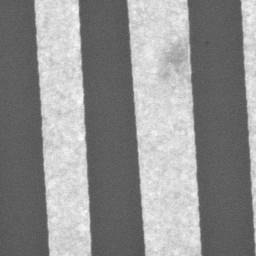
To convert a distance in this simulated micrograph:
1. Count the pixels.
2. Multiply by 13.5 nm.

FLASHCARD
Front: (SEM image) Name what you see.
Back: lines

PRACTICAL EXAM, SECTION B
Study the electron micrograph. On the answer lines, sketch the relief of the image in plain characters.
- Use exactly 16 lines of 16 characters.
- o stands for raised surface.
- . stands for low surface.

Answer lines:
..ooo...oooo...o
..ooo...oooo...o
..ooo...oooo...o
..ooo...oooo...o
..ooo...oooo...o
...oo...oooo...o
...oo...oooo...o
...oo....ooo....
...oo....ooo....
...oo....ooo....
...oo....ooo....
...oo....ooo....
...ooo...ooo....
...ooo...ooo....
...ooo...ooo....
...ooo...oooo...